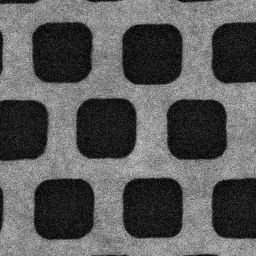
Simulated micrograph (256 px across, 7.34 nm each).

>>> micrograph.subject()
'holes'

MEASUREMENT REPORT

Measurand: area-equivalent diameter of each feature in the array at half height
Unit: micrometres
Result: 0.482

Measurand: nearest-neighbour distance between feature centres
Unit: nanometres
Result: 644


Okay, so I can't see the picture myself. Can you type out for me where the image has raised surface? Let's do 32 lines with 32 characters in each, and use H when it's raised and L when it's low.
HHHHHHHHHHHHHHHHHHHHHHHHHHHHHHHH
HHHHHHHHHHHHHHHHHHHHHHHHHHHHHHHH
HHHHHHHHHHHHHHHHHHHHHHHHHHHHHHHH
HHHHHLLLLLLHHHHHLLLLLLHHHHHLLLLL
HHHHLLLLLLLLHHHLLLLLLLLHHHHLLLLL
HHHHLLLLLLLLHHHLLLLLLLLHHHLLLLLL
HHHHLLLLLLLLHHHLLLLLLLLHHHHLLLLL
HHHHLLLLLLLLHHHLLLLLLLLHHHLLLLLL
HHHHLLLLLLLLHHHLLLLLLLLHHHLLLLLL
HHHHHLLLLLLHHHHHLLLLLLHHHHHLLLLL
HHHHHHHLHHHHHHHHHLLLLHHHHHHHHHHH
HHHHHHHHHHHHHHHHHHHHHHHHHHHHHHHH
HLHHHHHHHHHLLLLLHHHHHHHLLLHHHHHH
LLLLLLHHHHLLLLLLLHHHHLLLLLLLHHHH
LLLLLLHHHHLLLLLLLHHHHLLLLLLLHHHH
LLLLLLHHHHLLLLLLLHHHHLLLLLLLHHHH
LLLLLLHHHHLLLLLLLHHHHLLLLLLLHHHH
LLLLLLHHHLLLLLLLLHHHHLLLLLLLHHHH
LLLLLLHHHHLLLLLLLHHHHLLLLLLLHHHH
LLLLLHHHHHLLLLLLHHHHHHLLLLLLHHHH
HHHHHHHHHHHHHHHHHHHHHHHHHHHHHHHH
HHHHHHHHHHHHHHHHHHHHHHHHHHHHHHHH
HHHHHHLLLLHHHHHHHLLLLLHHHHHHLLLL
HHHHHLLLLLLHHHHHLLLLLLLHHHHLLLLL
HHHHLLLLLLLLHHHLLLLLLLLHHHHLLLLL
HHHHLLLLLLLLHHHLLLLLLLLHHHLLLLLL
HHHHLLLLLLLLHHHLLLLLLLLHHHLLLLLL
HHHHLLLLLLLLHHHLLLLLLLLHHHLLLLLL
HHHHLLLLLLLLHHHHLLLLLLLHHHHLLLLL
HHHHHLLLLLLHHHHHLLLLLLHHHHHLLLLL
HHHHHHHHHHHHHHHHHHHHHHHHHHHHHHHH
HHHHHHHHHHHHHHHHHHHHHHHHHHHHHHHH